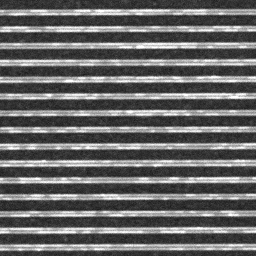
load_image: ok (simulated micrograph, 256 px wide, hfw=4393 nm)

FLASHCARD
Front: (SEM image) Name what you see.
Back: parallel lines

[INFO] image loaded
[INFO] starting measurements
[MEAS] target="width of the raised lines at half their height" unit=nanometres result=81.5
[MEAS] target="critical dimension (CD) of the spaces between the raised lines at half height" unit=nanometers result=217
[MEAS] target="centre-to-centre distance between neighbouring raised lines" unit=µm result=0.288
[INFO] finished